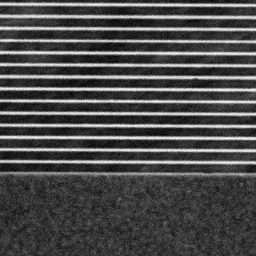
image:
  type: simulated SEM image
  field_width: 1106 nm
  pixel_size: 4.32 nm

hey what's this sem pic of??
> parallel lines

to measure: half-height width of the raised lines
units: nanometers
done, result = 11.6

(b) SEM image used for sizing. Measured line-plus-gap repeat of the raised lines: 52.3 nm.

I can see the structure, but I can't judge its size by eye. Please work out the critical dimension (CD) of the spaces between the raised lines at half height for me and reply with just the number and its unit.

0.0432 micrometres